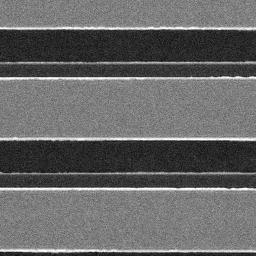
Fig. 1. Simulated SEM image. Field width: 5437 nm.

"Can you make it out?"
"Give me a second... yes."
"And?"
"lines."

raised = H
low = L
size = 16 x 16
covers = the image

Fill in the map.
HHHHHHHHHHHHHHHH
HHHHHHHHHHHHHHHH
LLLLLLLLLLLLLLLL
LLLLLLLLLLLLLLLL
LLLLLLLLLLLLLLLL
HHHHHHHHHHHHHHHH
HHHHHHHHHHHHHHHH
HHHHHHHHHHHHHHHH
HHHHHHHHHHHHHHHH
LLLLLLLLLLLLLLLL
LLLLLLLLLLLLLLLL
LLLLLLLLLLLLLLLL
HHHHHHHHHHHHHHHH
HHHHHHHHHHHHHHHH
HHHHHHHHHHHHHHHH
HHHHHHHHHHHHHHHH